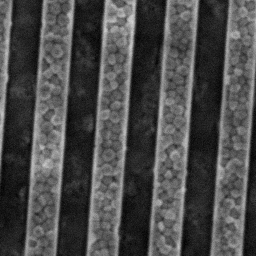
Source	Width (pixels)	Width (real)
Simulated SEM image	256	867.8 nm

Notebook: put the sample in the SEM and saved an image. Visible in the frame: parallel lines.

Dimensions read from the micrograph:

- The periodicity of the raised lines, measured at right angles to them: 209 nanometers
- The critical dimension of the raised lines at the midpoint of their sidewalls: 105 nanometers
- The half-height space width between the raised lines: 105 nm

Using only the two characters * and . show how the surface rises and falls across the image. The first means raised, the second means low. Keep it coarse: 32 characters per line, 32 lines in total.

**...****....****....****....***
*....****....****....****....***
*....****....****....****....***
*....****....****....***....****
*....****....****....***....****
*....****....****....***....****
*....****....***....****....****
*....****....***....****....****
*....****....***....****....****
*....****....***....****....****
*....***.....***....****....****
*....***....****....****....****
*....***....****....****....****
*....***....****....****....****
....****....****....****....***.
....****....****....****....***.
....****....****....****...****.
....****....****....***....****.
....****....****....***....****.
....****....****...****....****.
....****....***....****....****.
....****....***....****....****.
....****....***....****....****.
....***.....***....****....****.
....***....****....****....****.
....***....****....****....****.
....***....****....****....****.
...****....****....****....****.
...****....****....****....***..
...****....****....****....***..
...****....****....****...****..
...****....****....***....****..